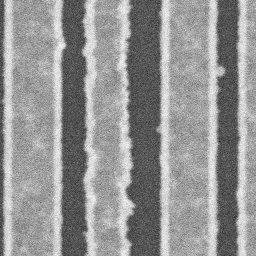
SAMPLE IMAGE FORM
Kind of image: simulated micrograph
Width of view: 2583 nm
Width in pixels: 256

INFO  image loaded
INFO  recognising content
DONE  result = one or a few lines or trenches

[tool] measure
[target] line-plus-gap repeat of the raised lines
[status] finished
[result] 786 nm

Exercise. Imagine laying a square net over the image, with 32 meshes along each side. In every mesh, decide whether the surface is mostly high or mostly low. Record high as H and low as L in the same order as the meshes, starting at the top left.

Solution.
LHHHHHHLLLLHHHHLLLLLLHHHHHHLLLHH
LHHHHHHLLLLHHHHLLLLLLHHHHHHLLLHH
LHHHHHHLLLLHHHHLLLLLLHHHHHHLLLHH
LHHHHHHLLLLHHHHHLLLLLHHHHHHLLLHH
LHHHHHHLLLLHHHHLLLLLLHHHHHHLLLHH
LHHHHHHHLLLHHHHLLLLLLHHHHHLLLLHH
LHHHHHHLLLLHHHHLLLLLLHHHHHHLLLHH
LHHHHHHLLLLHHHHLLLLLLHHHHHHLLLHH
LHHHHHHLLLLHHHHLLLLLLHHHHHHLLLHH
LHHHHHHLLLLHHHHHLLLLLHHHHHHLLLHH
LHHHHHHLLLLHHHHHLLLLLHHHHHHLLLHH
LHHHHHHLLLLHHHHHLLLLLHHHHHLLLLHH
LHHHHHHLLLLHHHHHLLLLLHHHHHHLLLHH
LHHHHHHLLLLHHHHHLLLLLHHHHHHLLLHH
LHHHHHHLLLLHHHHHLLLLLHHHHHHLLLHH
LHHHHHHLLLLHHHHLLLLLLHHHHHHLLLHH
LHHHHHHLLLLHHHHLLLLLLHHHHHLLLLHH
LHHHHHHLLLLHHHHLLLLLLHHHHHHLLLHH
LHHHHHHLLLLHHHHHLLLLLHHHHHHLLLHH
LHHHHHHLLLLLHHHHLLLLLHHHHHHLLLHH
LHHHHHHLLLLHHHHHLLLLLHHHHHHLLLHH
LHHHHHHLLLLHHHHHLLLLLHHHHHLLLLHH
LHHHHHHLLLLHHHHHLLLLLHHHHHHLLLHH
LHHHHHHLLLLHHHHLLLLLLHHHHHHLLLHH
LHHHHHHLLLLHHHHHLLLLLHHHHHHLLLHH
LHHHHHHLLLLHHHHHLLLLLHHHHHHLLLHH
LHHHHHHLLLLHHHHHLLLLLHHHHHHLLLHH
LHHHHHHLLLLHHHHLLLLLLHHHHHHLLLHH
LHHHHHHLLLLHHHHHLLLLLHHHHHHLLLHH
LHHHHHHLLLLHHHHLLLLLLHHHHHHLLLHH
LHHHHHHLLLLHHHHHLLLLLHHHHHHLLLHH
LHHHHHHLLLLHHHHHLLLLLHHHHHLLLLHH